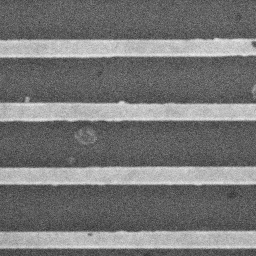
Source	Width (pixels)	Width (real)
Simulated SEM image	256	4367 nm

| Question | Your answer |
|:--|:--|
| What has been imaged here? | lines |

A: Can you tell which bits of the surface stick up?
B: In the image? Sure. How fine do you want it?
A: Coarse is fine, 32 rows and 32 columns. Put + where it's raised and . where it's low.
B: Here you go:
................................
................................
................................
................................
................................
++++++++++++++++++++++++++++++++
++++++++++++++++++++++++++++++++
................................
................................
................................
................................
................................
................................
++++++++++++++++++++++++++++++++
++++++++++++++++++++++++++++++++
................................
................................
................................
................................
................................
................................
++++++++++++++++++++++++++++++++
++++++++++++++++++++++++++++++++
................................
................................
................................
................................
................................
................................
++++++++++++++++++++++++++++++++
++++++++++++++++++++++++++++++++
................................